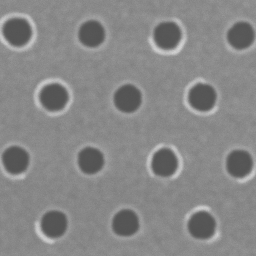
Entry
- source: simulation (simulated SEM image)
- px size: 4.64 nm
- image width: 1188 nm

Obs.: a regular array of holes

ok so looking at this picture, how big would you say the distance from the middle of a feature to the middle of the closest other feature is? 72.1 pixels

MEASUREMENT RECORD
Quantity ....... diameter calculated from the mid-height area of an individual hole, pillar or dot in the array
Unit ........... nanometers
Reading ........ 125